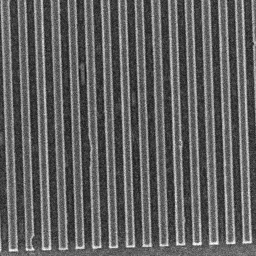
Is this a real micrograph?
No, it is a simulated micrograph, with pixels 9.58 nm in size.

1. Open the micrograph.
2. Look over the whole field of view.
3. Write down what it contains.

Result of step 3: parallel lines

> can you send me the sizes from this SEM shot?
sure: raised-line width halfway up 81.4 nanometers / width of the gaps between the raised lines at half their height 81.4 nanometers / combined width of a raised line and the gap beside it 0.16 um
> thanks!